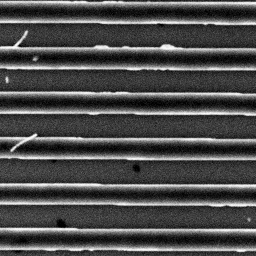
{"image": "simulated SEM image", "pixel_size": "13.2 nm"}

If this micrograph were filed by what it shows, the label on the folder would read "lines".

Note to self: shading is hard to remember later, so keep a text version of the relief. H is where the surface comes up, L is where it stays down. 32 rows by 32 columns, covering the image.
HHHHHHHHHHHHHHHHHHHHHHHHHHHHHHHH
HHHHHHHHHHHHHHHHHHHHHHHHHHHHHHHH
HHHHHHHHHHHHHHHHHHHHHHHHHHHHHHHH
LLLLLLLLLLLLLLLLLLLLLLLLLLLLLLLL
LLLLLLLLLLLLLLLLLLLLLLLLLLLLLLLL
LLLLLLLLLLLLLLLLLLLLLLLLLLLLLLLL
HHHHHHHHHHHHHHHHHHHHHHHHHHHHHHHH
HHHHHHHHHHHHHHHHHHHHHHHHHHHHHHHH
LHHHHHHHHHHHHHHHHHHHHHHHHHHHHHHH
LLLLLLLLLLLLLLLLLLLLLLLLLLLLLLLL
LLLLLLLLLLLLLLLLLLLLLLLLLLLLLLLL
LLLLLLLLLLLLLLLLLLLLLLLLLLLLLLLL
HHHHHHHHHHHHHHHHHHHHHHHHHHHHHHHH
HHHHHHHHHHHHHHHHHHHHHHHHHHHHHHHH
LLLLLLLLLLLLLLLLLLLLLLLLLLLLLLLL
LLLLLLLLLLLLLLLLLLLLLLLLLLLLLLLL
LLLLLLLLLLLLLLLLLLLLLLLLLLLLLLLL
HHHHHHHHHHHHHHHHHHHHHHHHHHHHHHHH
HHHHHHHHHHHHHHHHHHHHHHHHHHHHHHHH
HHHHHHHHHHHHHHHHHHHHHHHHHHHHHHHH
LLLLLLLLLLLLLLLLLLLLLLLLLLLLLLLL
LLLLLLLLLLLLLLLLLLLLLLLLLLLLLLLL
LLLLLLLLLLLLLLLLLLLLLLLLLLLLLLLL
HHHHHHHHHHHHHHHHHHHHHHHHHHHHHHHH
HHHHHHHHHHHHHHHHHHHHHHHHHHHHHHHH
LLLLLLLLLLLLLLHHHHHHHHHHHHHHHHHH
LLLLLLLLLLLLLLLLLLLLLLLLLLLLLLLL
LLLLLLLLLLLLLLLLLLLLLLLLLLLLLLLL
LLLLLLLLLLLLLLLLLLLLLLLLLLLLLLLL
HHHHHHHHHHHHHHHHHHHHHHHHHHHHHHHH
HHHHHHHHHHHHHHHHHHHHHHHHHHHHHHHH
LLLLLLLLLLLLLLLLLLLLLLLLLLLLLLLL